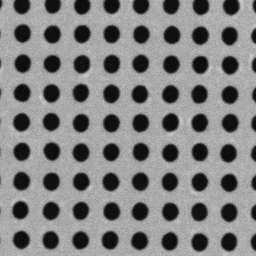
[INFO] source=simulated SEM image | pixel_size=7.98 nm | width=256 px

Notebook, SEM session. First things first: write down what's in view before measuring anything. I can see a regular array of holes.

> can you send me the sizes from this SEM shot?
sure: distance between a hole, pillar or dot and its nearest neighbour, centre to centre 0.232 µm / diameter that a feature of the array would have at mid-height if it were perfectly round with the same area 0.141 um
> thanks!